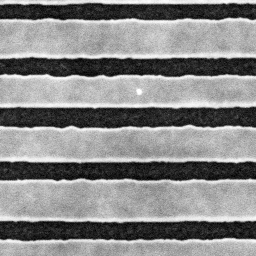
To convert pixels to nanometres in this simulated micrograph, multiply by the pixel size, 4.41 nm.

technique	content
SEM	lines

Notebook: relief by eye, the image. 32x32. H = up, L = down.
LLHHLHHHLLLLLLLLLLLLLLLLLLLLLLLL
LLLLLLLLLLLLLLLLLLLLLLLLLLLLLLLL
LLLLLHHLLLLLLLLHHLLLLLLHLLLLHHHL
HHHHHHHHHHHHHHHHHHHHHHHHHHHHHHHH
HHHHHHHHHHHHHHHHHHHHHHHHHHHHHHHH
HHHHHHHHHHHHHHHHHHHHHHHHHHHHHHHH
HHHHHHHHHHHHHHHHHHHHHHHHHHHHHHHH
LLLLLLLLLLLLLLLLLLLLLLLLLLLLLLLL
LLLLLLLLLLLLLLLLLLLLLLLLLLLLLLLL
HHHHHHLLLHLLHLHHHHHHLLLHHLLHHHHL
HHHHHHHHHHHHHHHHHHHHHHHHHHHHHHHH
HHHHHHHHHHHHHHHHHHHHHHHHHHHHHHHH
HHHHHHHHHHHHHHHHHHHHHHHHHHHHHHHH
LLLLLLLLLLLLLLLLLLLLLLLLLLLLLLLL
LLLLLLLLLLLLLLLLLLLLLLLLLLLLLLLL
LLLLLLLLLLLLLLLLLLLLLLLLLLLLLLLL
HHHHHHHHHHHHHHHHHHHHHHHHHHHHHHHH
HHHHHHHHHHHHHHHHHHHHHHHHHHHHHHHH
HHHHHHHHHHHHHHHHHHHHHHHHHHHHHHHH
HHHHHHHHHHHHHHHHHHHHHHHHHHHHHHHH
LLLLLLLLLLLLLLLLLLLLLLLLLLLLLLLL
LLLLLLLLLLLLLLLLLLLLLLLLLLLLLLLL
LLLLLLLLLHHLHLLHHLLLLLLLHLLLHLLH
HHHHHHHHHHHHHHHHHHHHHHHHHHHHHHHH
HHHHHHHHHHHHHHHHHHHHHHHHHHHHHHHH
HHHHHHHHHHHHHHHHHHHHHHHHHHHHHHHH
HHHHHHHHHHHHHHHHHHHHHHHHHHHHHHHH
HHHHHHHHHHHHHHHHHHHHHHHHHHHHHHHH
LLLLLLLLLLLLLLLLLLLLLLLLLLLLLLLL
LLLLLLLLLLLLLLLLLLLLLLLLLLLLLLLL
HHHHHHHHHHHHHHHHHHHHHHHHHHHHHHHH
HHHHHHHHHHHHHHHHHHHHHHHHHHHHHHHH